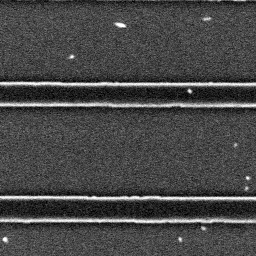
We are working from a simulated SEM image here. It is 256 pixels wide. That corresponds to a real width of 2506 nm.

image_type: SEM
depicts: lines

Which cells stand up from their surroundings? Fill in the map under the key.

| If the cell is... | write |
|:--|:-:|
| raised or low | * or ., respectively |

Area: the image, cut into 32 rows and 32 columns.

................................
................................
................................
................................
................................
................................
................................
................................
................................
................................
********************************
********************************
********************************
................................
................................
................................
................................
................................
................................
................................
................................
................................
................................
................................
................................
********************************
********************************
********************************
................................
................................
................................
................................